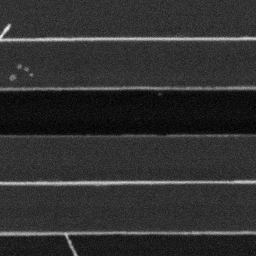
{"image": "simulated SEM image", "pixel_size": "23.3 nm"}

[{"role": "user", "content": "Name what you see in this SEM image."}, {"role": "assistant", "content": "lines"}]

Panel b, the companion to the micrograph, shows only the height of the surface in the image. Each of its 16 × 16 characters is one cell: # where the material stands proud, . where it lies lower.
################
################
################
################
################
###########.....
................
................
...........#.###
################
################
################
################
################
################
................